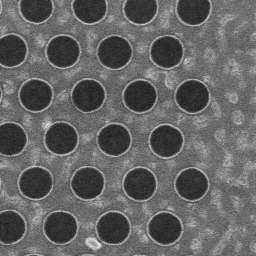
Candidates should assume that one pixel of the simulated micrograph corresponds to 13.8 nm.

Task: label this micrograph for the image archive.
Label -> a regular array of raised bodies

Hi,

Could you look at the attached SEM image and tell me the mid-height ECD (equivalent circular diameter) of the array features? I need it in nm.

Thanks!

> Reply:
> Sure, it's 471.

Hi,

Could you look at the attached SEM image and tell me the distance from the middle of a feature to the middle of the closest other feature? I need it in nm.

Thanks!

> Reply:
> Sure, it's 697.